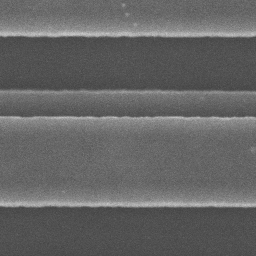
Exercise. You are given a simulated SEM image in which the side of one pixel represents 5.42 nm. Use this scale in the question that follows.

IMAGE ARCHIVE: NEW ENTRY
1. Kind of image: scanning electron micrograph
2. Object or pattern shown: lines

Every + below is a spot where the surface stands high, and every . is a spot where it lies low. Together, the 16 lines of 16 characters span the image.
++++++++++++++++
++++++++++++++++
................
................
................
................
................
++++++++++++++++
++++++++++++++++
++++++++++++++++
++++++++++++++++
++++++++++++++++
++++++++++++++++
................
................
................